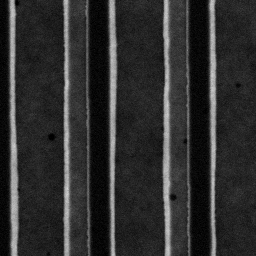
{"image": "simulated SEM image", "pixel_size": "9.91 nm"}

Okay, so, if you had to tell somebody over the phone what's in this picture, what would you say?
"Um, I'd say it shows lines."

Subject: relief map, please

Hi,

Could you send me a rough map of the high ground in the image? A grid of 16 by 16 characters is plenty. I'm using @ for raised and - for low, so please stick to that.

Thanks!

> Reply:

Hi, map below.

@---@@@---@@@---
@---@@@---@@@---
@---@@@---@@@---
@---@@@---@@@---
@---@@@---@@@---
@---@@@---@@@---
@---@@@---@@@---
@---@@@---@@@---
@---@@@---@@@---
@---@@@---@@@---
@---@@@---@@@---
@---@@@---@@@---
@---@@@---@@@---
@---@@@---@@@---
@---@@@----@@---
@---@@@----@@---